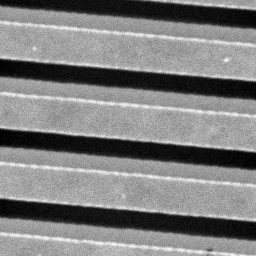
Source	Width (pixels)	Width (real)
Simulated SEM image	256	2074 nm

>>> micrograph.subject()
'lines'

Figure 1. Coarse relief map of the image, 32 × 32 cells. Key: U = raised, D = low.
DDDDDDDDDDDDDDDDDDDDDDDUUUUUUUUU
UUUUUUUDDDDDDDDDDDDDDDDDDDDDDDDD
UUUUUUUUUUUUUUUUUUUDDDDDDDDDDDDD
UUUUUUUUUUUUUUUUUUUUUUUUUUUUUDDD
UUUUUUUUUUUUUUUUUUUUUUUUUUUUUUUU
UUUUUUUUUUUUUUUUUUUUUUUUUUUUUUUU
UUUUUUUUUUUUUUUUUUUUUUUUUUUUUUUU
DDUUUUUUUUUUUUUUUUUUUUUUUUUUUUUU
DDDDDDDDDDDDDUUUUUUUUUUUUUUUUUUU
DDDDDDDDDDDDDDDDDDDDDDDDUUUUUUUU
UUUUUUUUDDDDDDDDDDDDDDDDDDDDDDDD
UUUUUUUUUUUUUUUUUUUUDDDDDDDDDDDD
UUUUUUUUUUUUUUUUUUUUUUUUUUUUUUUD
UUUUUUUUUUUUUUUUUUUUUUUUUUUUUUUU
UUUUUUUUUUUUUUUUUUUUUUUUUUUUUUUU
UUUUUUUUUUUUUUUUUUUUUUUUUUUUUUUU
DDDDDDUUUUUUUUUUUUUUUUUUUUUUUUUU
DDDDDDDDDDDDDDDDDUUUUUUUUUUUUUUU
UUDDDDDDDDDDDDDDDDDDDDDDDDDUUUUU
UUUUUUUUUUUUUDDDDDDDDDDDDDDDDDDD
UUUUUUUUUUUUUUUUUUUUUUUDDDDDDDDD
UUUUUUUUUUUUUUUUUUUUUUUUUUUUUUUU
UUUUUUUUUUUUUUUUUUUUUUUUUUUUUUUU
UUUUUUUUUUUUUUUUUUUUUUUUUUUUUUUU
UUUUUUUUUUUUUUUUUUUUUUUUUUUUUUUU
DDDDDDDDUUUUUUUUUUUUUUUUUUUUUUUU
DDDDDDDDDDDDDDDDDDDDUUUUUUUUUUUU
UUUDDDDDDDDDDDDDDDDDDDDDDDDDDDUU
UUUUUUUUUUUUUUDDDDDDDDDDDDDDDDDD
UUUUUUUUUUUUUUUUUUUUUUUUDDDDDDDD
UUUUUUUUUUUUUUUUUUUUUUUUUUUUUUUU
UUUUUUUUUUUUUUUUUUUUUUUUUUUUUUUU